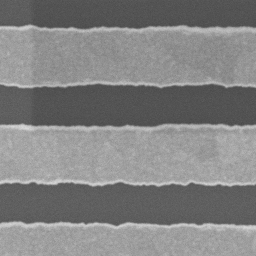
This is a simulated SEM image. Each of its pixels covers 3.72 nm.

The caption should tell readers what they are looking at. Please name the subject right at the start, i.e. lines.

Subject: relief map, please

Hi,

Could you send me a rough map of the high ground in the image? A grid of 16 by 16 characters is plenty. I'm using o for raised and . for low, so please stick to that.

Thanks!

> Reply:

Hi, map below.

................
................
oooooooooooooooo
oooooooooooooooo
oooooooooooooooo
................
................
................
oooooooooooooooo
oooooooooooooooo
oooooooooooooooo
.....oo.oooooooo
................
................
oooooooooooooooo
oooooooooooooooo